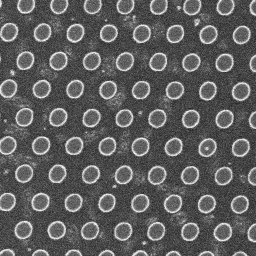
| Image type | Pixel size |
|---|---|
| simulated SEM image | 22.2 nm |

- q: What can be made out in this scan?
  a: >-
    a regular array of raised bodies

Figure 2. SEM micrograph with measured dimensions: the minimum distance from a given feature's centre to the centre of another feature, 0.723 um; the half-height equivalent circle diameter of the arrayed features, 0.384 microns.